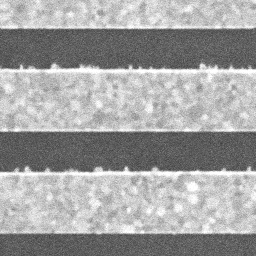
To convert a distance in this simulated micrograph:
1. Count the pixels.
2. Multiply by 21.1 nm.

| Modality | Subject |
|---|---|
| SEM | lines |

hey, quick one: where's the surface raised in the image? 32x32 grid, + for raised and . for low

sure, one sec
++++++++++++++++++++++++++++++++
++++++++++++++++++++++++++++++++
++++++++++++++++++++++++++++++++
................................
................................
................................
................................
................................
................................
++++++++++++++++++++++++++++++++
++++++++++++++++++++++++++++++++
++++++++++++++++++++++++++++++++
++++++++++++++++++++++++++++++++
++++++++++++++++++++++++++++++++
++++++++++++++++++++++++++++++++
++++++++++++++++++++++++++++++++
................................
................................
................................
................................
................................
................................
++++++++++++++++++++++++++++++++
++++++++++++++++++++++++++++++++
++++++++++++++++++++++++++++++++
++++++++++++++++++++++++++++++++
++++++++++++++++++++++++++++++++
++++++++++++++++++++++++++++++++
++++++++++++++++++++++++++++++++
................................
................................
................................